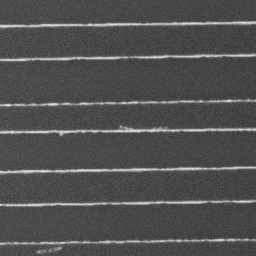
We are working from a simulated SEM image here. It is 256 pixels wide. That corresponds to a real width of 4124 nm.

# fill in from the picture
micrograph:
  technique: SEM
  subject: lines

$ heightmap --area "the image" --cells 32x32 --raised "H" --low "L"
LLLLLLLLLLLLLLLLLLLLLLLLLLLLLLLL
LLLLLLLLLLLLLLLLLLLLLLLLLLLLLLLL
LLLLLLLLLLLLLLLLLLLLLLLLLLLLLLLL
HHHHHHHHHHHHHHHHHHHHHHHHHHHHHHHH
HHHHHHHHHHHHHHHHHHHHHHHHHHHHHHHH
HHHHHHHHHHHHHHHHHHHHHHHHHHHHHHHH
HHHHHHHHHHHHHHHHHHHHHHHHHHHHHHHH
LLLLLLLLLLLLLLLLLLLLLLLLLLLLLLLL
LLLLLLLLLLLLLLLLLLLLLLLLLLLLLLLL
LLLLLLLLLLLLLLLLLLLLLLLLLLLLLLLL
LLLLLLLLLLLLLLLLLLLLLLLLLLLLLLLL
LLLLLLLLLLLLLLLLLLLLLLLLLLLLLLLL
LLLLLLLLLLLLLLLLLLLLLLLLLLLLLLLL
HHHHHHHHHHHHHHHHHHHHHHHHHHHHHHHH
HHHHHHHHHHHHHHHHHHHHHHHHHHHHHHHH
HHHHHHHHHHHHHHHHHHHHHHHHHHHHHHHH
HLLLLLLLLLLLLLLLLLLLLLLLLLLLLLLL
LLLLLLLLLLLLLLLLLLLLLLLLLLLLLLLL
LLLLLLLLLLLLLLLLLLLLLLLLLLLLLLLL
LLLLLLLLLLLLLLLLLLLLLLLLLLLLLLLL
LLLLLLLLLLLLLLLLLLLLLLLLLLLLLLLL
LLHHHHHHHHHHHHHHHHHHHHHHHHHHHHHH
HHHHHHHHHHHHHHHHHHHHHHHHHHHHHHHH
HHHHHHHHHHHHHHHHHHHHHHHHHHHHHHHH
HHHHHHHHHHHHHHHHHHHHHHHHHHHHHHHH
HHHHHHHLLLLLLLLLLLLLLLLLLLLLLLLL
LLLLLLLLLLLLLLLLLLLLLLLLLLLLLLLL
LLLLLLLLLLLLLLLLLLLLLLLLLLLLLLLL
LLLLLLLLLLLLLLLLLLLLLLLLLLLLLLLL
LLLLLLLLLLLLLLLLLLLLLLLLLLLLLLLL
HHHHHHHHHHHHHHHHHHHHHHHHHHHHHHHH
HHHHHHHHHHHHHHHHHHHHHHHHHHHHHHHH